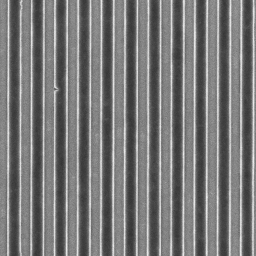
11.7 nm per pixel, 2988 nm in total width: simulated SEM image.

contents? parallel lines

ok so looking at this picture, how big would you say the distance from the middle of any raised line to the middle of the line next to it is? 272 nm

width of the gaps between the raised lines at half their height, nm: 120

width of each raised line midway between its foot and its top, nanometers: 153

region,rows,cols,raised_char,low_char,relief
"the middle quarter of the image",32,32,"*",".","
*..****..***...***...***...***..
*..****..***...***...***...***..
*..****..***...***...***...***..
*..****..***...***...***...***..
*..***...***...***...***...***..
*..***...***...***...***...***..
*..***...***...***...***...***..
*..***...***...***...***...***..
*..***...***...***...***...***..
*..***...***...***...***...***..
*..***...***...***...***...***..
*..***...***...***...***...***..
*..***...***...***...***...***..
*..***...***...***...***...***..
*..***...***...***...***...***..
*..***...***...***...***...***..
*..***...***...***...***...***..
*..***...***...***...***...***..
*..***...***...***...***...***..
*..***...***...***...***...***..
*..***...***...***...***...***..
*..***...***...***...***...***..
*..***...***...***...***...***..
*..***...***...***...***...***..
*..***...***...***...***...***..
*..***...***...***...***...***..
*..***...***...***...***...***..
*..***...***...***...***...***..
*..***...***...***...***...***..
*..***...***...***...***...***..
*..***...***...***...***...***..
*..***...***...***...***...***..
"